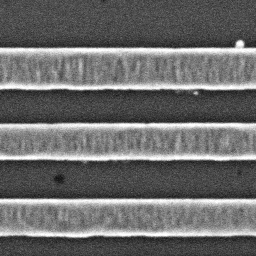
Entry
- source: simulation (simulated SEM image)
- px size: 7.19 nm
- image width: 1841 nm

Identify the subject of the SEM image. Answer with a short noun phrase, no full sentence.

lines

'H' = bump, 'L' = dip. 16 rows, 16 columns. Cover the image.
LLLLLLLLLLLLLLLL
LLLLLLLLLLLLLLLL
LLLLLLLLLLLLLLLL
HHHHHHHHHHHHHHHH
HHHHHHHHHHHHHHHH
LLLLHHLLLLLLLLLL
LLLLLLLLLLLLLLLL
LLLLLLLLLLLLLLLL
HHHHHHHHHHHHHHHH
HHHHHHHHHHHHHHHH
LLLLLLLLLLLLLLLL
LLLLLLLLLLLLLLLL
LLLLLLLLLLLLLLLL
HHHHHHHHHHHHHHHH
HHHHHHHHHHHHHHHH
LLLLLLLLLLLLLLLL